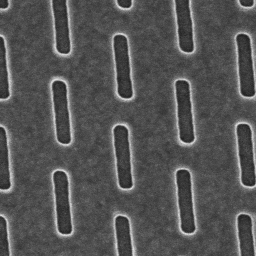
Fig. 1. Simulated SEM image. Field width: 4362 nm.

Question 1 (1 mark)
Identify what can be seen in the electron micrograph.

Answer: holes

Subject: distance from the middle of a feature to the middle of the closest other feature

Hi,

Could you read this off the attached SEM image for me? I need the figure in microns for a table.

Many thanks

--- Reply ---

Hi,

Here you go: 1.3